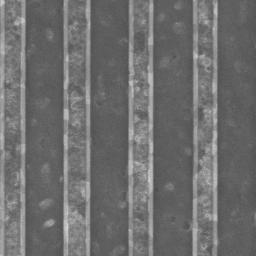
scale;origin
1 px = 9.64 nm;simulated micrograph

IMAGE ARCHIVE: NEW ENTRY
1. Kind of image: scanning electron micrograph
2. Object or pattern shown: one or a few lines or trenches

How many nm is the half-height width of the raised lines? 201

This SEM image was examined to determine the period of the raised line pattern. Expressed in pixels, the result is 64.2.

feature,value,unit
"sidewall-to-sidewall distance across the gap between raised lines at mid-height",410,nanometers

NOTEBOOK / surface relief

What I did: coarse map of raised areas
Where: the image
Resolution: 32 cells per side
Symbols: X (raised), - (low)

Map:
XXX-----XXX-----XXX-----XXX-----
XXX-----XXX-----XXX-----XXX-----
XXX-----XXX-----XXX-----XXX-----
XXX-----XXX-----XXX-----XXX-----
XXX-----XXX-----XXX-----XXX-----
XXX-----XXX-----XXX-----XXX-----
XXX-----XXX-----XXX-----XXX-----
XXX-----XXX-----XXX-----XXX-----
XXX-----XXX-----XXX-----XXX-----
XXX-----XXX-----XXX-----XXX-----
XXX-----XXX-----XXX-----XXX-----
XXX-----XXX-----XXX-----XXX-----
XXX-----XXX-----XXX------XX-----
XXX-----XXX-----XXX------XX-----
XXX-----XXX-----XXX------XX-----
XXX-----XXX-----XXX------XX-----
XXX-----XXX-----XXX------XX-----
XXX-----XXX-----XXX------XX-----
XXX-----XXX-----XXX------XX-----
XXX-----XXX-----XXX------XX-----
XXX-----XXX-----XXX------XX-----
XXX-----XXX-----XXX------XX-----
XXX-----XXX-----XXX-----XXX-----
XXX-----XXX-----XXX-----XXX-----
XXX-----XXX-----XXX-----XXX-----
XXX-----XXX-----XXX-----XXX-----
XXX-----XXX-----XXX-----XXX-----
XXX-----XXX-----XXX-----XXX-----
XXX-----XXX-----XXX-----XXX-----
XXX-----XXX-----XXX-----XXX-----
XXX-----XXX-----XXX-----XXX-----
XXX-----XXX-----XXX-----XXX-----